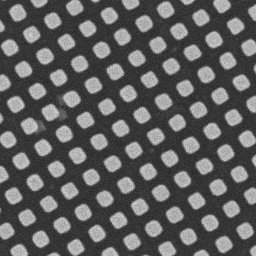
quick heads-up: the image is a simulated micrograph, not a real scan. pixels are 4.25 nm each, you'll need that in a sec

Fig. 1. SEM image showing a regular array of raised bodies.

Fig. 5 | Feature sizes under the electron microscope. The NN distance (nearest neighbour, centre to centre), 25.1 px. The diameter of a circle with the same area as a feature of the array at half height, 67.3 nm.